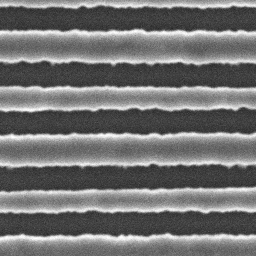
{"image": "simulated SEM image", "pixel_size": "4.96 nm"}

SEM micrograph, lines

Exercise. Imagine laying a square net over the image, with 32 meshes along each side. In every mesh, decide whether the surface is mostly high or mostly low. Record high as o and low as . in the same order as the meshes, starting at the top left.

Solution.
oooooooooooooooooooooooooooooooo
................................
................................
................................
oooooooooooooooooooooooooooooooo
oooooooooooooooooooooooooooooooo
oooooooooooooooooooooooooooooooo
oooooooooooooooooooooooooooooooo
................................
................................
................................
oooooooooooooooooooooooooooooooo
oooooooooooooooooooooooooooooooo
oooooooooooooooo.oo.oooooooooo.o
................................
................................
................................
oooooooooooooooooooooooooooooooo
oooooooooooooooooooooooooooooooo
oooooooooooooooooooooooooooooooo
ooooooooooooooooooo.oo.oo...o.oo
................................
................................
................................
oooooooooooooooooooooooooooooooo
oooooooooooooooooooooooooooooooo
o.oooooo.................o......
................................
................................
..o....o..oooo.....ooo..ooooo.oo
oooooooooooooooooooooooooooooooo
oooooooooooooooooooooooooooooooo